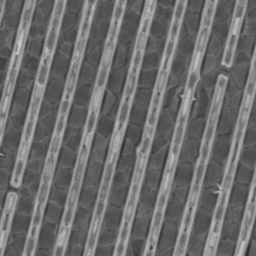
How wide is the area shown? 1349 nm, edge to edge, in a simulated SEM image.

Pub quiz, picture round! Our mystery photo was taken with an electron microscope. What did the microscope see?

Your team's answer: parallel lines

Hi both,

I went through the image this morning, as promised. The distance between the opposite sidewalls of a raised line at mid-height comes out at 50.4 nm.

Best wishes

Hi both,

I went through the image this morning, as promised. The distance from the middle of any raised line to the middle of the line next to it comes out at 154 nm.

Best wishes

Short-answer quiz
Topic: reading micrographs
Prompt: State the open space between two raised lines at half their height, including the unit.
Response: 105 nm